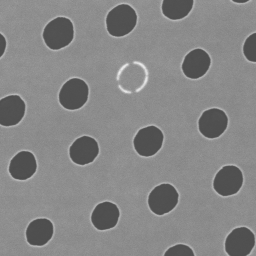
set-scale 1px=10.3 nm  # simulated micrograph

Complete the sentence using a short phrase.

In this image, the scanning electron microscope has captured a regular array of holes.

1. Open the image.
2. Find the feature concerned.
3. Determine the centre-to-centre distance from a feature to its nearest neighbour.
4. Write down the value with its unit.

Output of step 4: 0.621 µm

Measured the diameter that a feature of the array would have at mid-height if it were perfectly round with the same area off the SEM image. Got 306 nm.